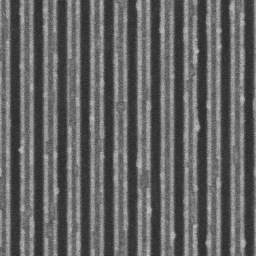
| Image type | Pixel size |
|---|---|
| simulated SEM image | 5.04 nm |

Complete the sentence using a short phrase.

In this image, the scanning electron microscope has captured parallel lines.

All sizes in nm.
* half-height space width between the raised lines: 55.5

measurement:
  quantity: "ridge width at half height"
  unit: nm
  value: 59.9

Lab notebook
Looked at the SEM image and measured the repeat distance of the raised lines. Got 118 nm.